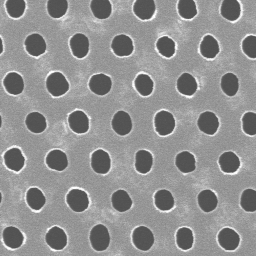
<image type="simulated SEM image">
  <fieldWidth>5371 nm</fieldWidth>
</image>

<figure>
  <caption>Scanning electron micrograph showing a regular array of holes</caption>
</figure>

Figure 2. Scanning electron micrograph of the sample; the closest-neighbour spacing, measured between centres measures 897 nm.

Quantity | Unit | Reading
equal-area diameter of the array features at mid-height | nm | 461